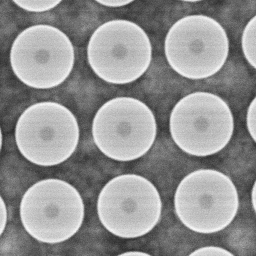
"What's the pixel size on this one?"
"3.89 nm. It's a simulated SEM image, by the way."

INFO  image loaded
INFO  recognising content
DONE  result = an array of small figures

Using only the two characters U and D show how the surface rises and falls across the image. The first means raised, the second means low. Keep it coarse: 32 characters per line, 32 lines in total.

DDUUUUUDDDDDDUUUDDDDDDDDDDDDDDDD
DDDDDDDDDDDDDDDDDDDDDDDDDDDDDDDD
DDDDDDDDDDDDDDDDDDDDDDDUUUUDDDDU
DDDDUUUDDDDDUUUUUUDDDUUUUUUUDDDU
DDUUUUUUDDDDUUUUUUDDDUUUUUUUDDUU
DDUUUUUUUDDUUUUUUUUDDUUUUUUUDDUU
DUUUUUUUUDDUUUUUUUUDDUUUUUUUDDUU
DUUUUUUUUDDUUUUUUUUDDUUUUUUUDDDU
DDUUUUUUUDDDUUUUUUDDDDUUUUUDDDDD
DDUUUUUUDDDDUUUUUDDDDDDUUUDDDDDD
DDDUUUUDDDDDDDDDDDDDDDDDDDDDDDDD
DDDDDDDDDDDDDDDDDDDDDDDDDDDDDDDD
DDDDDDDDDDDDDDUUUDDDDDDUUUUUDDDD
DDDDUUUUDDDDDUUUUUDDDDUUUUUUUDDU
DDDUUUUUUDDDUUUUUUUDDUUUUUUUUDDU
DDUUUUUUUUDDUUUUUUUDDUUUUUUUUDDU
DDUUUUUUUUDDUUUUUUUDDUUUUUUUUDDU
DDUUUUUUUUDDUUUUUUUDDDUUUUUUUDDD
DDUUUUUUUDDDUUUUUUUDDDDUUUUUDDDD
DDDUUUUUUDDDDDUUUUDDDDDDDDDDDDDD
DDDDDUUDDDDDDDDDDDDDDDDDDDDDDDDD
DDDDDDDDDDDDDDDDDDDDDDDDUUUDDDDD
DDDDDDUDDDDDDDUUUUDDDDDUUUUUUDDD
DDDDUUUUUDDDDUUUUUUDDDUUUUUUUDDD
DDDUUUUUUUDDUUUUUUUUDDUUUUUUUUDD
UDDUUUUUUUDDUUUUUUUUDDUUUUUUUUDD
UDDUUUUUUUDDUUUUUUUUDDUUUUUUUUDD
UDDUUUUUUUDDDUUUUUUUDDDUUUUUUDDD
DDDUUUUUUUDDDUUUUUUDDDDDUUUUDDDD
DDDDUUUUUDDDDDDUUDDDDDDDDDDDDDDD
DDDDDDDDDDDDDDDDDDDDDDDDDDDDDDDD
DDDDDDDDDDDDDDDDDDDDDDDDUUUUUDDD